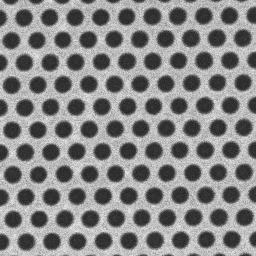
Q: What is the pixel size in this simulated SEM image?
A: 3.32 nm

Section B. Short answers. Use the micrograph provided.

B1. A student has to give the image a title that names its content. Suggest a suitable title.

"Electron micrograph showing a regular array of holes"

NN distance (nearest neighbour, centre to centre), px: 25.4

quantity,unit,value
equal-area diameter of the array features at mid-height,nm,54.5